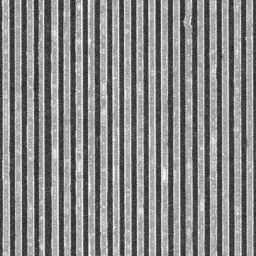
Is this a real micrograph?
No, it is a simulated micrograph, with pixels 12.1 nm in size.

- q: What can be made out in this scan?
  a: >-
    parallel lines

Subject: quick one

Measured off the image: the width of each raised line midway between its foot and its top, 71.1 nanometres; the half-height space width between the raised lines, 6.75 pixels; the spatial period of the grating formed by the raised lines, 12.2 pixels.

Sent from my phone